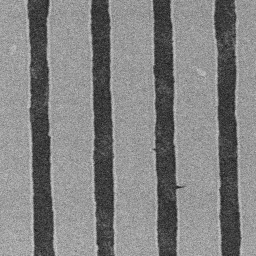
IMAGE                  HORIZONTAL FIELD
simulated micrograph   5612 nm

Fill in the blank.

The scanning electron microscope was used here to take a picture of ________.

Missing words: parallel lines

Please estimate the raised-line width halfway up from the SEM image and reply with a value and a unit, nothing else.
904 nm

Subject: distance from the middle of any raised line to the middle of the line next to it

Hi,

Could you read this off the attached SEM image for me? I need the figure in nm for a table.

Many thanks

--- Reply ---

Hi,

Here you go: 1360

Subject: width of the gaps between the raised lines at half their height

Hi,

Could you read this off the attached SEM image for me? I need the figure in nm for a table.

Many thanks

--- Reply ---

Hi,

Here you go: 452